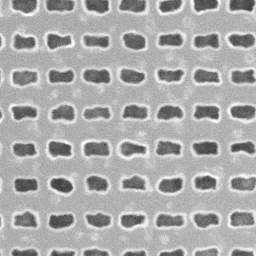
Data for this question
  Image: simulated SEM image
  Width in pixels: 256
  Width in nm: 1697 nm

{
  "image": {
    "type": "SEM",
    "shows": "a regular array of holes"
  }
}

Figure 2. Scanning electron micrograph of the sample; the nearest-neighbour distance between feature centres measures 0.23 um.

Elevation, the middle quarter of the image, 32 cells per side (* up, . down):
********************************
*.***......***....******..**..**
...**......***......***.......**
...**......***......***.......**
..****.....****....*******.*****
********************************
********************************
********************************
********************************
********************************
..**************...******..*****
...**......****......***......**
...**.......***......**.......**
...**......****......**.......**
*.******************************
********************************
********************************
********************************
********************************
******..*..****..*******....****
..***......***......***......***
..***.......**.......**......***
..***.......**......***......***
********************************
********************************
********************************
********************************
********************************
******....*****.....*******...**
..***......***.......***......**
..****.....***.......***......**
..****.....*************.....***